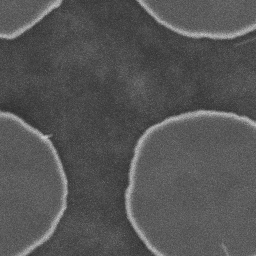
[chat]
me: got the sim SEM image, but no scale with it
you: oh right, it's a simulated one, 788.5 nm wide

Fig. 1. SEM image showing raised bodies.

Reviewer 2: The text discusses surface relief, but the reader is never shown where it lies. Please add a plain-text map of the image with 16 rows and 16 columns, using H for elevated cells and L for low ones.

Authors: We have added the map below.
HHHLLLLLLHHHHHHH
HHLLLLLLLLHHHHHH
LLLLLLLLLLLLLLLL
LLLLLLLLLLLLLLLL
LLLLLLLLLLLLLLLL
LLLLLLLLLLLLLLLL
LLLLLLLLLLLLLLLL
HLLLLLLLLLLHHHHL
HHHLLLLLLHHHHHHH
HHHLLLLLLHHHHHHH
HHHHLLLLHHHHHHHH
HHHHLLLLHHHHHHHH
HHHHLLLLHHHHHHHH
HHHHLLLLHHHHHHHH
HHHLLLLLLHHHHHHH
HHLLLLLLLHHHHHHH